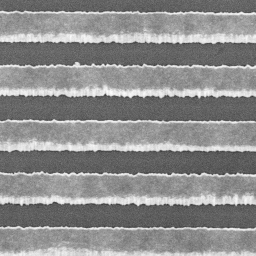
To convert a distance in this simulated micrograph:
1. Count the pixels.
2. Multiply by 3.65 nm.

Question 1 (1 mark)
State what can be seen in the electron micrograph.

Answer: lines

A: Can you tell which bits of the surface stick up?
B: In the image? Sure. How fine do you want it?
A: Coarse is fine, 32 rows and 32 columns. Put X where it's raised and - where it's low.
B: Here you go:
--------------------------------
XX-X---X------------------------
XXXXXXXXXXXXXXXXXXXXXXXXXXXXXXXX
XXXXXXXXXXXXXXXXXXXXXXXXXXXXXXXX
XXXXXXXXXXXXXXXXXXXXXXXXXXXXXXXX
--------------------------------
--------------------------------
--------------------------------
XXXXXXXXXXXXXXXXXXXXXXXXXXXXXXXX
XXXXXXXXXXXXXXXXXXXXXXXXXXXXXXXX
XXXXXXXXXXXXXXXXXXXXXXXXXXXXXXXX
XXXXXXXXXXXXXXXXXXXXXXXXXXXXXXXX
--------------------------------
--------------------------------
--------------------------------
XXXXXXXXXXXXXXXXXXXXXXXXXXXXXXXX
XXXXXXXXXXXXXXXXXXXXXXXXXXXXXXXX
XXXXXXXXXXXXXXXXXXXXXXXXXXXXXXXX
XXXXXXXXXXXXXXXXXXXXXXXXXXXXXXXX
--------------------------------
--------------------------------
--------------------------------
XXXXXXXXXXXXXXXXXXXXXXXXXXXXXXXX
XXXXXXXXXXXXXXXXXXXXXXXXXXXXXXXX
XXXXXXXXXXXXXXXXXXXXXXXXXXXXXXXX
--------------------------------
--------------------------------
--------------------------------
XXXXXXXXXX-XXXXX-X-X---X-X------
XXXXXXXXXXXXXXXXXXXXXXXXXXXXXXXX
XXXXXXXXXXXXXXXXXXXXXXXXXXXXXXXX
XXXXXXXXXXXXXXXXXXXXXXXXXXXXXXXX